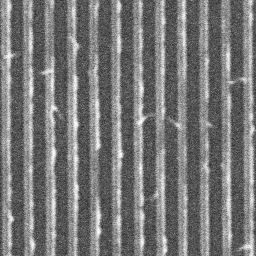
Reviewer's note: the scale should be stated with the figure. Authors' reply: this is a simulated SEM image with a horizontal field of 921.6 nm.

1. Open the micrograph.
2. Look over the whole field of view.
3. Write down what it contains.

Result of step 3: parallel lines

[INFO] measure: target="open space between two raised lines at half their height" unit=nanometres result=52.6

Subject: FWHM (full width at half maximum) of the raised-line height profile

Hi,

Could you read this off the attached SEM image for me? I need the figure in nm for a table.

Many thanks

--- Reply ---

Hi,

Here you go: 26.5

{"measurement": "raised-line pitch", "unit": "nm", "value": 79.2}